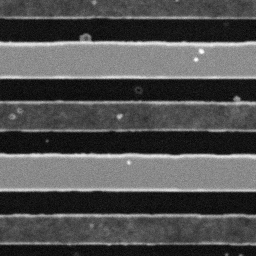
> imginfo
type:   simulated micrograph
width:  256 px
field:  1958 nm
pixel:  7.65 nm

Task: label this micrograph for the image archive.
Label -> lines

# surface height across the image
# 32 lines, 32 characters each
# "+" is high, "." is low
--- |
++++++++++++++++++++++++++++++++
++++++++++++++++++++++++++++++++
................................
................................
................................
++++++++++++++++++++++++++++++++
++++++++++++++++++++++++++++++++
++++++++++++++++++++++++++++++++
++++++++++++++++++++++++++++++++
++++++++++++++++++++++++++++++++
................................
................................
................................
++++++++++++++++++++++++++++++++
++++++++++++++++++++++++++++++++
++++++++++++++++++++++++++++++++
................................
................................
................................
++++++++++++++++++++++++++++++++
++++++++++++++++++++++++++++++++
++++++++++++++++++++++++++++++++
++++++++++++++++++++++++++++++++
++++++++++++++++++++++++++++++++
................................
................................
................................
++++++++++++++++++++++++++++++++
++++++++++++++++++++++++++++++++
++++++++++++++++++++++++++++++++
........+....+.+..+..........+++
................................